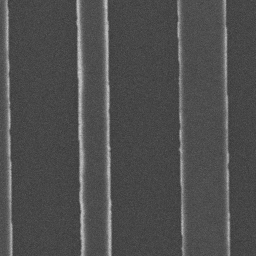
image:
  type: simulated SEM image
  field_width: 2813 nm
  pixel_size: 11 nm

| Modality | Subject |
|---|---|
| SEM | lines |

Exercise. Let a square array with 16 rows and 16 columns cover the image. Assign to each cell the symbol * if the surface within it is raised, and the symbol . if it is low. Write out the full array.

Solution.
.....**....***..
.....**....***..
.....**....***..
*....**....***..
*....**....***..
*....**....***..
*....**....***..
*....**....***..
*....**....***..
*....**....***..
*....**....***..
*....**....***..
*....**....***..
*....**....***..
*....**....***..
*....**....***..